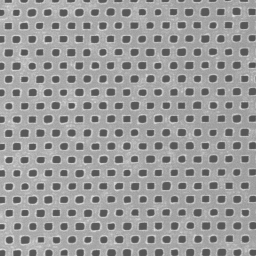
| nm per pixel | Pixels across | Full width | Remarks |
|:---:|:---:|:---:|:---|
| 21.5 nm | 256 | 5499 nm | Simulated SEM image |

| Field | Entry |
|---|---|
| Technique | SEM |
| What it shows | a regular array of holes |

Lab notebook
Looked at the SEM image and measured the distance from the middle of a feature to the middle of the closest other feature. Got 326 nm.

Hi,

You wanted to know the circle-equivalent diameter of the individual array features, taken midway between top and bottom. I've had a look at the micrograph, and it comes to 0.176 micrometres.